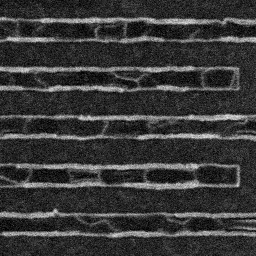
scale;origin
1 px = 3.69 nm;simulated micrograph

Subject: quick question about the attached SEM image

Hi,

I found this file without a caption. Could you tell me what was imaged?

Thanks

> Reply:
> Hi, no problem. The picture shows parallel lines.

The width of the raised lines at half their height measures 0.0825 micrometres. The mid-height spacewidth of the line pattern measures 95.9 nm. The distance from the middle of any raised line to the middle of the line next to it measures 0.179 micrometres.